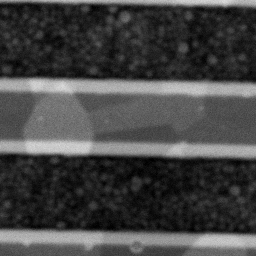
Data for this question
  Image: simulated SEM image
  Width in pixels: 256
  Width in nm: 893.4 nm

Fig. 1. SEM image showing one or a few lines or trenches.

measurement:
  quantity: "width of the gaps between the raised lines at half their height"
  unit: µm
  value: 0.314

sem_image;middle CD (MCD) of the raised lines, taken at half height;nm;213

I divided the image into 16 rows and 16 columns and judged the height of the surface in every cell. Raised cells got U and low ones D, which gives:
DDDDDDDDDDDDDDDD
DDDDDDDDDDDDDDDD
DDDDDDDDDDDDDDDD
DDDDDDDDDDDDDDDD
DDDDDDDDDDDDDDDD
UUUUUUUUUUDDDDDD
UUUUUUUUUUUUUUUU
UUUUUUUUUUUUUUUU
UUUUUUUUUUUUUUUU
DDDDDDDDDDDDDDDD
DDDDDDDDDDDDDDDD
DDDDDDDDDDDDDDDD
DDDDDDDDDDDDDDDD
DDDDDDDDDDDDDDDD
DDDDDDDDDDDDDDDD
UUUUUUUUUUUUUUUU